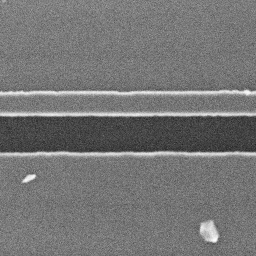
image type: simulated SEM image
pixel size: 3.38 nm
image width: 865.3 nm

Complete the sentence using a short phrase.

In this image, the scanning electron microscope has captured lines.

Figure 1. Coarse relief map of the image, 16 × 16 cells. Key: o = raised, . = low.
oooooooooooooooo
oooooooooooooooo
oooooooooooooooo
oooooooooooooooo
oooooooooooooooo
oooooooooooooooo
oooooooooooooooo
................
................
................
oooooooooooooooo
oooooooooooooooo
oooooooooooooooo
oooooooooooooooo
oooooooooooooooo
oooooooooooooooo